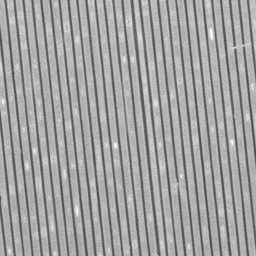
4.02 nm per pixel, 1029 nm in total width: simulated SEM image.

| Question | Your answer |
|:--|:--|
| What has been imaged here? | parallel lines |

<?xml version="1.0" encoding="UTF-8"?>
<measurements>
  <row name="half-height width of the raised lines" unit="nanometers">27.4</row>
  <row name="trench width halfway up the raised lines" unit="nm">10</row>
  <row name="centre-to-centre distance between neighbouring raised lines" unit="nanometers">35.8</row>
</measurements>